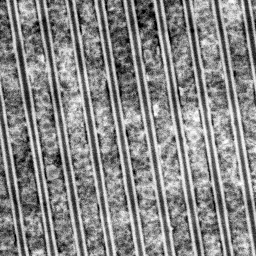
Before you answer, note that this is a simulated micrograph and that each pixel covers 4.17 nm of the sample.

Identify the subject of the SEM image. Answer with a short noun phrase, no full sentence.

parallel lines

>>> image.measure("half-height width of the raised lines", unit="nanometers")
29.8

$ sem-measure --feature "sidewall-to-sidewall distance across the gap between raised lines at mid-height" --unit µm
0.0894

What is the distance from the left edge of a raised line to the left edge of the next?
120 nanometres